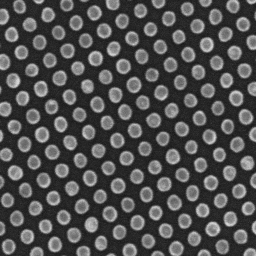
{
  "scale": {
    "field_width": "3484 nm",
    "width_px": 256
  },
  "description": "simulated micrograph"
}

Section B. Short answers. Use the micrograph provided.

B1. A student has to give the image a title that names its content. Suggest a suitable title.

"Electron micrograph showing a regular array of raised bodies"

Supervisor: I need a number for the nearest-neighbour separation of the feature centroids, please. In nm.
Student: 274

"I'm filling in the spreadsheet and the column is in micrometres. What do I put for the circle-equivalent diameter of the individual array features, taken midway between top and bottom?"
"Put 0.178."